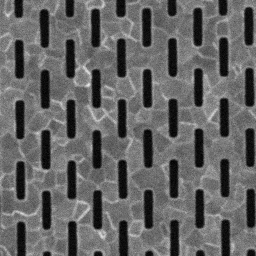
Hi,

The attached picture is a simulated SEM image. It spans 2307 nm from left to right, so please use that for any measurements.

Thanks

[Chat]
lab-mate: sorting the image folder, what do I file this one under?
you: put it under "groups of lines, slits or small figures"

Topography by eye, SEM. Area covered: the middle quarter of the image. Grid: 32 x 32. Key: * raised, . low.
...**********...**********...***
...****..****...****..****...***
...****..****...***...****..****
*.*****..*****.****...**********
*******..**********...**********
*******..**********...**********
*******..**********...**********
*******..**********...**********
*******..*****.****...*****.****
*..****..****...***...****..****
...****..****...****..****...***
...**********...**********...***
...**********...**********...***
...**********...**********...***
...**********...**********...***
...**********...**********...***
...*****.****...****..****...***
...****..****...****..****...***
*..****...****.*****..*****.****
*******...**********..**********
*******...**********..**********
*******...**********..**********
*******...**********..**********
*******...**********..**********
*..****...****..****..****...***
*..****..****...****..****...***
*..**********...**********...***
*..**********...**********...***
*..**********...**********...***
*..**********...**********...***
*..**********...**********...***
*..*****.****...****..****...***